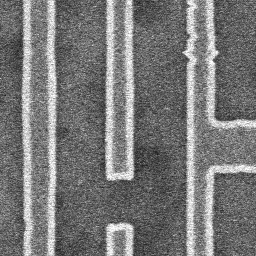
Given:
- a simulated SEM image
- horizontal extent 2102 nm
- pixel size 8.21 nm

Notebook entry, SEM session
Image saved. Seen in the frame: one or a few lines or trenches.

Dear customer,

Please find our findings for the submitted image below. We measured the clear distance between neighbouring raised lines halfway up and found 489 nanometres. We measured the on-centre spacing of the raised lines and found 660 nanometres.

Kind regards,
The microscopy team